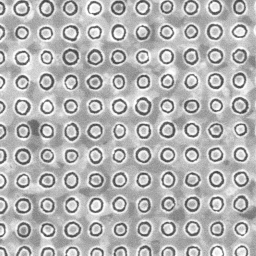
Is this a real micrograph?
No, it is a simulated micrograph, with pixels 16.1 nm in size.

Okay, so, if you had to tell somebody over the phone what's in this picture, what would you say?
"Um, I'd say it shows a regular array of ring-shaped grooves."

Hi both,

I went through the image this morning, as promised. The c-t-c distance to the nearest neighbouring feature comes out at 23.8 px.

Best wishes